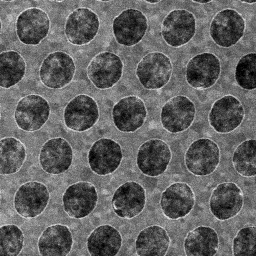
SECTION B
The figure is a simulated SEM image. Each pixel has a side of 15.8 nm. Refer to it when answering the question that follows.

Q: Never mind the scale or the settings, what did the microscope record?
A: a regular array of holes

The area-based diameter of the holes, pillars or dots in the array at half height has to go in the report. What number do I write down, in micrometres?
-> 0.563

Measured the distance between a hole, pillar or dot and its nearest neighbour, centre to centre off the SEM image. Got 770 nanometers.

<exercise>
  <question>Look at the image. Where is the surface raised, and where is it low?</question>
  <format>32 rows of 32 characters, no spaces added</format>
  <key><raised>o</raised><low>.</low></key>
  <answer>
oooooooooooooooooooooooooooooooo
ooo...ooo...ooo...oooo..ooo...oo
oo....oo....oo....oo....ooo...oo
oo....oo....oo....oo....oo.....o
oo....oo....oo....oo....oo....oo
ooo..oooo..oooo..oooo..oooo..ooo
o.ooooo.oooooooooooooooooooooooo
...ooo...ooo...ooo...ooo...ooo..
...oo....oo....oo....oo.....o...
...oo....oo....oo....oo....oo...
..oooo..oooo..oooo...ooo...ooo..
oooooooooooooooooooooooooooooooo
ooo...ooo...ooo...ooo...ooo...oo
oo....oo....oo....oo....oo....oo
oo....oo....oo....oo....oo....oo
oo...ooo....oo....oo....oo....oo
ooooooooooooooooooooo.ooooo..ooo
..oooo..oooo..ooooo.ooooo.ooooo.
...oo....oo....oo....ooo...ooo..
...oo.o..oo....oo....oo....oo...
...oo....oo....oo....oo....oo...
..oooo..oooo..oooo..oooo...ooo..
oooooooooooooooooooooooooooooooo
oo....ooo...ooo...ooo...ooo...oo
oo....oo....oo....oo....oo....oo
oo....oo....ooo...oo....oo....oo
oo...ooo...oooo...oo....oo..o.oo
oooooooooooooooooooooooooooooooo
..oooo..oooo..oooo..ooooo.ooooo.
...oo....oo....oo....oo....oo...
...oo....oo....oo....oo....oo...
...oo....oo....oo....oo....oo...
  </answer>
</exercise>